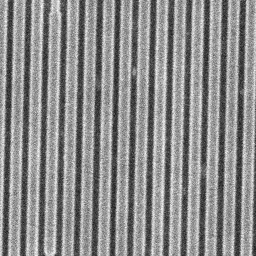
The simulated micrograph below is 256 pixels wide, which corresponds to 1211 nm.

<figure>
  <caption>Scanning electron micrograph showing parallel lines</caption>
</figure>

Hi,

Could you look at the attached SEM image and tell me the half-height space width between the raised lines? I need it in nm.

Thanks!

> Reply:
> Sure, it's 32.5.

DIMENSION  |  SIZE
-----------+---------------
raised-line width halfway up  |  52 nm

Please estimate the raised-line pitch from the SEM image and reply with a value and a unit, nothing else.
84.5 nm